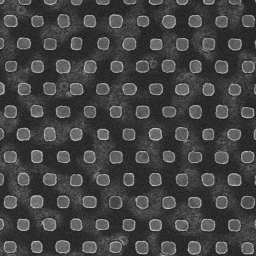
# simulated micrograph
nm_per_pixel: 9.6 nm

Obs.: a regular array of raised bodies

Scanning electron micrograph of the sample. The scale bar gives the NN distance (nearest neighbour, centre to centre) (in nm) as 248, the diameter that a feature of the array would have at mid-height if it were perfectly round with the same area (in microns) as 0.121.